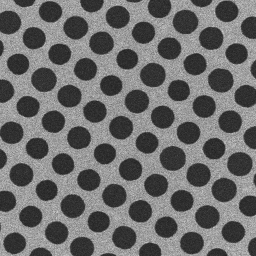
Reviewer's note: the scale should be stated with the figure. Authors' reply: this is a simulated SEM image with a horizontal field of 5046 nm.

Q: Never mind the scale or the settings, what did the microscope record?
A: a regular array of holes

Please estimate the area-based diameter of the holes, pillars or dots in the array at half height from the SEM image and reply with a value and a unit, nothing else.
457 nanometres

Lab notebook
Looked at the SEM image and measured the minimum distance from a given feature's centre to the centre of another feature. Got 593 nanometers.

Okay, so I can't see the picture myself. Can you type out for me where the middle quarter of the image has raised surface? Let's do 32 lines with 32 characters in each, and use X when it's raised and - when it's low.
XXX-----XXXXXX----XX----XXXXXX--
XX------XXXXXXXXXXX------XXXXX--
XXX-----XXXXXXXXXXX------XXXXXX-
XXXX---XXX----XXXXX------XXXXXXX
XXXXXXXXX------XXXXX-----XX---XX
---XXXXXX------XXXXXX---XX-----X
----XXXXX-----XXX--XXXXXXX-----X
----XXXXXX---XXX-----XXXXX-----X
----XXXXXXXXXXX------XXXXXX----X
----XX---XXXXXX------XXXXXXXXXXX
---XX-----XXXXX------XXX--XXXXXX
XXXXX------XXXXX----XX-----XXXXX
XXXXX------XXXXXXXXXXX------XXXX
XXXXX-----XXX---XXXXXX------XXXX
XXXXXXX--XXX-----XXXXX-----XXX--
XXXXXXXXXXX------XXXXXX----XX---
X-----XXXXX------XXXXXXXXXXX----
X------XXXXX-----XX---XXXXXX----
X------XXXXXX---XX-----XXXXXX---
X------XXXXXXXXXXX------XXXXX---
XX----XX----XXXXXX------XX-XXXXX
XXXXXXXX-----XXXXXX----XX-----XX
-XXXXXX------XXXXXXXXXXX------XX
--XXXXXX-----XXXXXXXXXXX-------X
--XXXXXX----XX-----XXXXX------XX
---XXXXXXXXXXX-----XXXXXX-----XX
--XXX--XXXXXXX------XXXXXX--XXX-
-XXX----XXXXXX-----XXX-XXXXXXXX-
XXX------XXXXXX----XX----XXXXXX-
XXX------XXXXXXXXXXX------XXXXX-
XXXX-----XX---XXXXXX------XXXXXX
XXXXX---XX-----XXXXX------XXX-XX